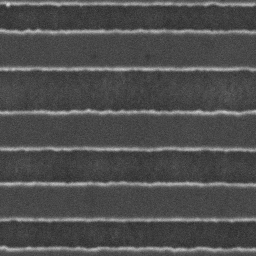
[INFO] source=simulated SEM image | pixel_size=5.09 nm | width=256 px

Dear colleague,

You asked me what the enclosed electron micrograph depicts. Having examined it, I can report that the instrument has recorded lines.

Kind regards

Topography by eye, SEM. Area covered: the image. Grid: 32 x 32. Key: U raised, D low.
UUUUUUUUUUUUUUUUUUUUUUUUUUUUUUUU
DDDDDDDDDDDDDDDDDDDDDDDDDDDDDDDD
DDDDDDDDDDDDDDDDDDDDDDDDDDDDDDDD
DDDDDDDDDDDDDDDDDDDDDDDDDDDDDDDD
UUUUUUUUUUUUUUUUUUUUUUUUUUUUUUUU
UUUUUUUUUUUUUUUUUUUUUUUUUUUUUUUU
UUUUUUUUUUUUUUUUUUUUUUUUUUUUUUUU
UUUUUUUUUUUUUUUUUUUUUUUUUUUUUUUU
UUUUUUUUUUUUUUUUUUUUUUUUUUUUUUUU
DDDDDDDDDDDDDDDDDDDDDDDDDDDDDDDD
DDDDDDDDDDDDDDDDDDDDDDDDDDDDDDDD
DDDDDDDDDDDDDDDDDDDDDDDDDDDDDDDD
DDDDDDDDDDDDDDDDDDDDDDDDDDDDDDDD
DDDDDDDDDDDDDDDDDDDDDDDDDDDDDDDD
UUUUUUUUUUUUUUUUUUUUUUUUUUUUUUUU
UUUUUUUUUUUUUUUUUUUUUUUUUUUUUUUU
UUUUUUUUUUUUUUUUUUUUUUUUUUUUUUUU
UUUUUUUUUUUUUUUUUUUUUUUUUUUUUUUU
UUUUUUUUUUUUUUUUUUUUUUUUUUUUUUUU
DDDDDDDDDDDDDDDDDDDDDDDDDDDDDDDD
DDDDDDDDDDDDDDDDDDDDDDDDDDDDDDDD
DDDDDDDDDDDDDDDDDDDDDDDDDDDDDDDD
DDDDDDDDDDDDDDDDDDDDDDDDDDDDDDDD
UUUUUUUUUUUUUUUUUUUUUUUUUUUUUUUU
UUUUUUUUUUUUUUUUUUUUUUUUUUUUUUUU
UUUUUUUUUUUUUUUUUUUUUUUUUUUUUUUU
UUUUUUUUUUUUUUUUUUUUUUUUUUUUUUUU
UUUUUUUUUUUUUUUUUUUUUUUUUUUUUUUU
DDDDDDDDDDDDDDDDDDDDDDDDDDDDDDDD
DDDDDDDDDDDDDDDDDDDDDDDDDDDDDDDD
DDDDDDDDDDDDDDDDDDDDDDDDDDDDDDDD
UUUUUUUUUUUUUUUUUUUUUUUUUUUUUUUU